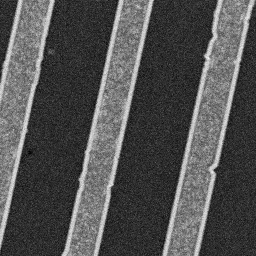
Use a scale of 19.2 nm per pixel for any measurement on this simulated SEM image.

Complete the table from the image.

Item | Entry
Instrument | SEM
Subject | one or a few lines or trenches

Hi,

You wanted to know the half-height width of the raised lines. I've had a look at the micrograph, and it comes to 0.584 microns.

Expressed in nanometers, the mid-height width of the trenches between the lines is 1300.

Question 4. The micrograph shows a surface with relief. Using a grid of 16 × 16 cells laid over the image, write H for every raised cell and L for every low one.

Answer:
LHHLLLLHHLLLLLHH
LHHLLLLHHLLLLHHL
LHHLLLLHHLLLLHHL
LHHLLLLHHLLLLHHL
HHLLLLLHLLLLLHHL
HHLLLLHHLLLLLHHL
HHLLLLHHLLLLHHLL
HHLLLLHHLLLLHHLL
HLLLLLHHLLLLHHLL
HLLLLLHLLLLLHHLL
HLLLLHHLLLLHHLLL
HLLLLHHLLLLHHLLL
HLLLLHHLLLLHHLLL
LLLLLHLLLLLHHLLL
LLLLHHLLLLLHHLLL
LLLLHHLLLLHHLLLL